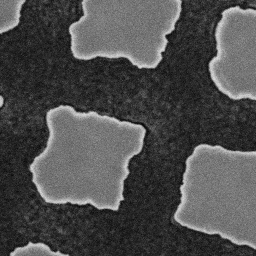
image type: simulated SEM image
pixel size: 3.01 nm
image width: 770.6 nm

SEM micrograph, raised bodies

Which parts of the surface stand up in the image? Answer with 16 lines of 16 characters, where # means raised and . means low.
#....######.....
#....######...##
....######....##
.....#####...###
.............###
..............##
................
...####.........
...######.......
...######...####
..######....####
..######...#####
...#####...#####
...........#####
.............###
.##.............